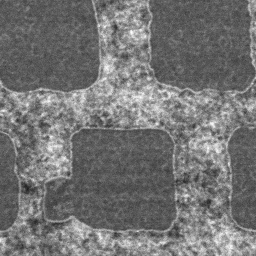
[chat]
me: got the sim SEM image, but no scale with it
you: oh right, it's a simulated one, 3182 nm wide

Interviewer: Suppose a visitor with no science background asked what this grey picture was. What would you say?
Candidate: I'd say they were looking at raised bodies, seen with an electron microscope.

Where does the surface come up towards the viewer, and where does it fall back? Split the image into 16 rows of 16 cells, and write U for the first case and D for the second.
UUUUUUDDDUUUUUUU
UUUUUUDDDUUUUUUU
UUUUUUDDDUUUUUUU
UUUUUUDDDUUUUUUU
UUUUUUDDDDUUUUUU
UUUUUDDDDDDUUUUD
DDDDDDDDDDDDDDDD
DDDDDDDDDDDDDDDD
DDDDDUUUUUUDDDUU
UDDDUUUUUUUDDDUU
UDDDUUUUUUUDDDUU
UDDUUUUUUUUDDDUU
UDDUUUUUUUUDDDUU
UDDUUUUUUUUDDDUU
DDDDDDDDDDDDDDDD
DDDDDDDDDDDDDDDD